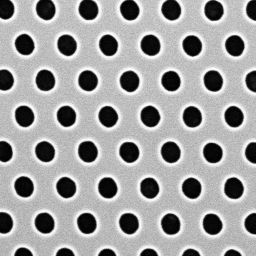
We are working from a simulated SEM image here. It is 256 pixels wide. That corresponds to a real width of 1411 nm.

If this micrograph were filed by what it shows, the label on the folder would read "a regular array of holes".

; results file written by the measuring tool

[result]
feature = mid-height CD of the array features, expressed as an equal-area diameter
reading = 116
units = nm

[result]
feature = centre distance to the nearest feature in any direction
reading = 227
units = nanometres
